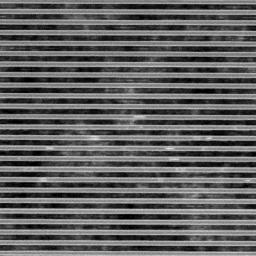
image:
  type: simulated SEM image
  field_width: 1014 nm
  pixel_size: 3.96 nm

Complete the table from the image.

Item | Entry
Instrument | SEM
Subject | parallel lines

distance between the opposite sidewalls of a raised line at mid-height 18.8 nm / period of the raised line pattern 41.7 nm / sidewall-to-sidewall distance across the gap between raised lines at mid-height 22.8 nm